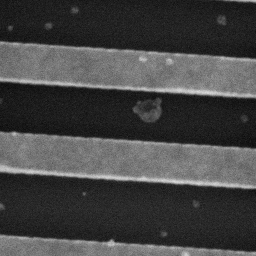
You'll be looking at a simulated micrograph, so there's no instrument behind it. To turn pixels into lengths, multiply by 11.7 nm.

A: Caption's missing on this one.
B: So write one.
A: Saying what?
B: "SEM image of lines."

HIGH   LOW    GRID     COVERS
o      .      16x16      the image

................
................
................
ooooooooooooo...
oooooooooooooooo
......oooooooooo
................
................
oooo............
oooooooooooooooo
oooooooooooooooo
............oooo
................
................
................
oooooooooooo....